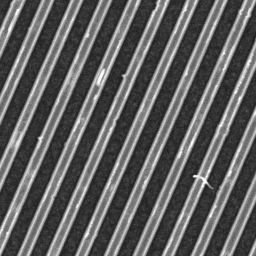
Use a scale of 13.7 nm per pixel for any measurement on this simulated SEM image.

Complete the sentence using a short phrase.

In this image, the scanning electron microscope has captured parallel lines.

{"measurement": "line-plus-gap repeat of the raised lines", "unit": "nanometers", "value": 362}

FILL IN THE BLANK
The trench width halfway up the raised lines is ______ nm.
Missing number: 235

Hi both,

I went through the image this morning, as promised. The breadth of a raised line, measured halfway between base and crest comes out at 124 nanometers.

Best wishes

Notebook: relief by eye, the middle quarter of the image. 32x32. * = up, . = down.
..***....***....***.....**.....*
.***.....**.....**.....***.....*
.***....***....***.....**.....**
.**.....**.....***....***.....**
***.....**.....**.....***....***
**.....***....***....***.....**.
**.....**.....**.....***....***.
*.....***....***.....**.....**..
*.....**.....***....***.....**..
*....***.....**.....**.....**...
.....**.....***....***.....**...
.....**.....**.....**.....***...
....**.....***....***.....**....
....**.....**.....***....***....
...***....***.....**.....**.....
...**.....***....***....***.....
..***....***.....**.....**.....*
..**.....***....***.....**.....*
.***.....**.....**.....***....**
.**.....***.....**.....**.....**
.**.....**.....***....***....***
***....***.....**.....**.....**.
**.....***....***....***.....**.
**....***.....**.....**.....***.
*.....***....***.....**.....**..
*.....**.....**.....***....***..
.....***.....**.....**.....**...
.....**.....**.....***....***...
....***.....**.....**.....**....
....**.....***....***.....**....
...***.....**.....**.....***....
...***....***.....**.....**.....